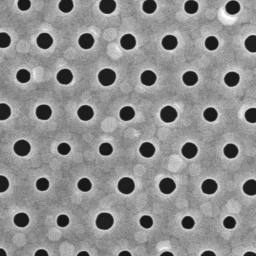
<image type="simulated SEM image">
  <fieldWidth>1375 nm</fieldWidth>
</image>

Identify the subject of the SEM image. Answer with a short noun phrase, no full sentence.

a regular array of holes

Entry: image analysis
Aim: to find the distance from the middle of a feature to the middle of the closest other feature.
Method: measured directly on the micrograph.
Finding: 0.222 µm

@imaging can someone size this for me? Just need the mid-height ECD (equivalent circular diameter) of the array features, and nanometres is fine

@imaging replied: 83.9